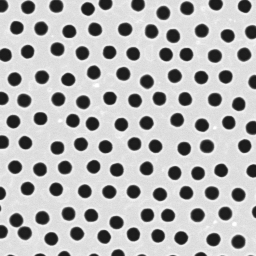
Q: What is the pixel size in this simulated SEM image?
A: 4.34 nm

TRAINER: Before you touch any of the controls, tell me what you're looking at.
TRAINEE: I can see a regular array of holes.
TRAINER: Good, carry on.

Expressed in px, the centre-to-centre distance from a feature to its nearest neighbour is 22.9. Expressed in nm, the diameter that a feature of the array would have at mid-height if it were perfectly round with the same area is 56.2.